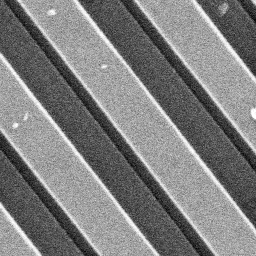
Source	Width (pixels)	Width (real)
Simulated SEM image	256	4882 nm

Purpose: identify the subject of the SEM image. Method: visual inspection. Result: lines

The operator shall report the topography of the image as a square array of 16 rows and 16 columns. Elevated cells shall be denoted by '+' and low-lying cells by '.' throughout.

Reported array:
.++++....++++...
..++++....+++...
...++++...++++..
....++++...++++.
+....+++....++++
++...++++....+++
+++...++++....++
+++....++++...++
++++....+++....+
.++++...++++....
..++++...++++...
...+++....++++..
....+++....++++.
+...++++....+++.
+....++++...++++
++....++++...+++